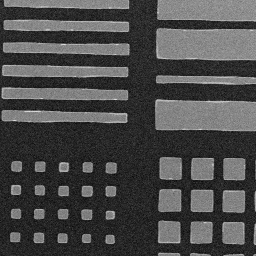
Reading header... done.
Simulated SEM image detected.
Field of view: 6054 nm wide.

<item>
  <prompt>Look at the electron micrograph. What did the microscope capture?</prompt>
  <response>groups of lines, slits or small figures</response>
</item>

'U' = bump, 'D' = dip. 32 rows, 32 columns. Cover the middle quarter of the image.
DDDDDDDDDDDDDDDDDDDDDDDDDDDDDDDD
UUUUUUUUUUUUUUUUDDDDDDDDDDDDDDDD
UUUUUUUUUUUUUUUUDDDDDDDDDDDDDDDD
DDDDDDDDDDDDDDDDDDDDDDDUUUUUUUUU
DDDDDDDDDDDDDDDDDDDDDDDUUUUUUUUU
DDDDDDDDDDDDDDDDDDDDDDDDDDDDDDDD
UUUUUUUDDDDDDDDDDDDDDDDDDDDDDDDD
UUUUUUUUUUUUUUUUDDDDDDDDDDDDDDDD
UUUUUUUUUUUUUUUUDDDDDDDDDDDDDDDD
DDDDDDDDDDDDDDDDDDDDDDDUUUUUUUUU
DDDDDDDDDDDDDDDDDDDDDDDUUUUUUUUU
DDDDDDDDDDDDDDDDDDDDDDDUUUUUUUUU
UUUUUUUUUUUUUUUDDDDDDDDUUUUUUUUU
UUUUUUUUUUUUUUUUDDDDDDDUUUUUUUUU
DDDDDDDDUUUUUUUDDDDDDDDUUUUUUUUU
DDDDDDDDDDDDDDDDDDDDDDDUUUUUUUUU
DDDDDDDDDDDDDDDDDDDDDDDDDUUUDDDD
DDDDDDDDDDDDDDDDDDDDDDDDDDDDDDDD
DDDDDDDDDDDDDDDDDDDDDDDDDDDDDDDD
DDDDDDDDDDDDDDDDDDDDDDDDDDDDDDDD
DDDDDDDDDDDDDDDDDDDDDDDDDDDDDDDD
DDDDDDDDDDDDDDDDDDDDDDDDDDDDDDDD
DDDDDDDDDDDDDDDDDDDDDDDDDDDDDDDD
DDDDDDDDDDDDDDDDDDDDDDDDUUUUDDDD
DDDDDDDDDDDDDDDDDDDDDDDDUUUUUDDD
UDDDDUUDDDDUUDDDDDDDDDDDUUUUUDDD
UDDDDUUDDDDUUDDDDDDDDDDDUUUUUDDD
DDDDDDDDDDDDDDDDDDDDDDDDUUUUUDDD
DDDDDDDDDDDDDDDDDDDDDDDDUUUUUDDD
DDDDDDDDDDDDDDDDDDDDDDDDDDDDDDDD
DDDDDDDDDDDDDDDDDDDDDDDDDDDDDDDD
UDDDDUUDDDDUUDDDDDDDDDDDDDDDDDDD